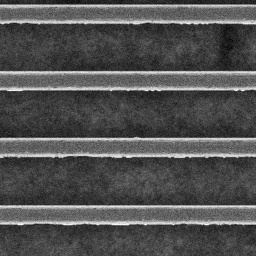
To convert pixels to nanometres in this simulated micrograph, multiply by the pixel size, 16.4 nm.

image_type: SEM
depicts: lines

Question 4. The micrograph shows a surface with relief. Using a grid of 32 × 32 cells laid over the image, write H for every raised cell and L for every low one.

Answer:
LLLLLLLLLLLLLLLLLLLLLLLLLLLLLLLL
HHHHHHHHHHHHHHHHHHHHHHHHHHHHHHHH
HHHHHHHHHHHHHHHHHHHHHHHHHHHHHHHH
LLLLLLLLLLLLLLLLLLLLLLLLLLLLLLLL
LLLLLLLLLLLLLLLLLLLLLLLLLLLLLLLL
LLLLLLLLLLLLLLLLLLLLLLLLLLLLLLLL
LLLLLLLLLLLLLLLLLLLLLLLLLLLLLLLL
LLLLLLLLLLLLLLLLLLLLLLLLLLLLLLLL
LLLLLLLLLLLLLLLLLLLLLLLLLLLLLLLL
HHHHHHHHHHHHHHHHHHHHHHHHHHHHHHHH
HHHHHHHHHHHHHHHHHHHHHHHHHHHHHHHH
LLLLLLLLLLLLLLLLLLLLLLLLLLLLLLLL
LLLLLLLLLLLLLLLLLLLLLLLLLLLLLLLL
LLLLLLLLLLLLLLLLLLLLLLLLLLLLLLLL
LLLLLLLLLLLLLLLLLLLLLLLLLLLLLLLL
LLLLLLLLLLLLLLLLLLLLLLLLLLLLLLLL
LLLLLLLLLLLLLLLLLLLLLLLLLLLLLLLL
HHHHHHHHHHHHHHHHHHHHHHHHHHHHHHHH
HHHHHHHHHHHHHHHHHHHHHHHHHHHHHHHH
HLHHHHLLLLLHLLHHHHHHHLLHHHLLHHHL
LLLLLLLLLLLLLLLLLLLLLLLLLLLLLLLL
LLLLLLLLLLLLLLLLLLLLLLLLLLLLLLLL
LLLLLLLLLLLLLLLLLLLLLLLLLLLLLLLL
LLLLLLLLLLLLLLLLLLLLLLLLLLLLLLLL
LLLLLLLLLLLLLLLLLLLLLLLLLLLLLLLL
LLLLLLLLLLLLLLLLLLLLLLLLLLLLLLLL
HHHHHHHHHHHHHHHHHHHHHHHHHHHHHHHH
HHHHHHHHHHHHHHHHHHHHHHHHHHHHHHHH
LLLLLLLLLLLLLLLLLLLLLLLLLLLLLLLL
LLLLLLLLLLLLLLLLLLLLLLLLLLLLLLLL
LLLLLLLLLLLLLLLLLLLLLLLLLLLLLLLL
LLLLLLLLLLLLLLLLLLLLLLLLLLLLLLLL